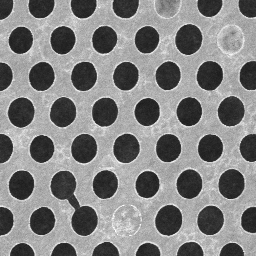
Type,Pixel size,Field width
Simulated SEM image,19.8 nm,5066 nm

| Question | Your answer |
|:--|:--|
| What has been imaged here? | a regular array of holes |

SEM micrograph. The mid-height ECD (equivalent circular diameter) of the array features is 543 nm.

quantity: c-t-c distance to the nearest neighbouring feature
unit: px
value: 41.7